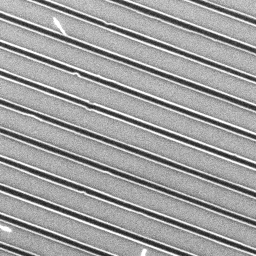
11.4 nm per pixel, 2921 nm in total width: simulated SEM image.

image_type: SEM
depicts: parallel lines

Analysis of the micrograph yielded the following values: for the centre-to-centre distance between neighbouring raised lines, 308 nm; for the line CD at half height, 80.4 nm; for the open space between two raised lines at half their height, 228 nm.